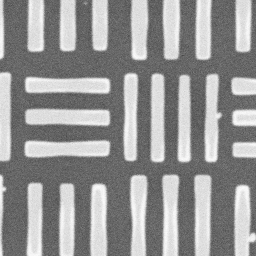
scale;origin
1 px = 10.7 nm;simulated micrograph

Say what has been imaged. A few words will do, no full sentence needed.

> groups of lines, slits or small figures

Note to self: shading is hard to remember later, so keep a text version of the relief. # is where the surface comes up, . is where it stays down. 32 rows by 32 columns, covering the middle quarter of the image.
................................
................................
................................
................##....###....##.
###########....###....###....##.
###########....###....###....##.
###########....###....###....##.
...............###....###....##.
...............###....###....##.
................##....###....##.
................##....###....##.
................##....###....##.
###########.....##....###....##.
###########.....##....###....##.
###########.....##....###....##.
................##....###....##.
................##....###....##.
................##....###....##.
................##....###....##.
................##....###....##.
###########....###....###....##.
###########....###....###....##.
###########.....##....###....##.
................##....###....##.
................................
................................
................................
................................
.................###.....###....
.................####....###....
##...............####....###....
##.....###.......###.....###....